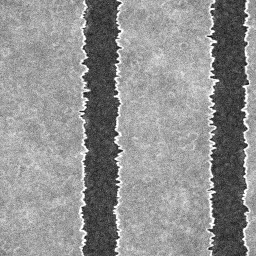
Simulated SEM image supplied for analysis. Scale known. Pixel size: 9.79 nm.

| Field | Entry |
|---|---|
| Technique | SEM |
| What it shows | one or a few lines or trenches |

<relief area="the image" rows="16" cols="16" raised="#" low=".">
#####..######..#
#####..######..#
#####..######..#
#####..######..#
#####..######..#
#####..######..#
#####..######..#
#####..######..#
#####..######..#
#####..######..#
#####..######..#
#####..######..#
#####..######..#
#####..######..#
#####..######..#
#####..######..#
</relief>